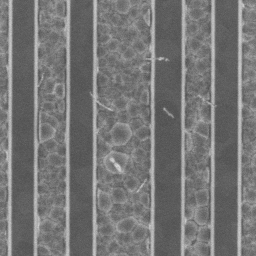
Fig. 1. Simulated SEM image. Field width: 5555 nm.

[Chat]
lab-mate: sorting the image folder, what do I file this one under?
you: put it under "one or a few lines or trenches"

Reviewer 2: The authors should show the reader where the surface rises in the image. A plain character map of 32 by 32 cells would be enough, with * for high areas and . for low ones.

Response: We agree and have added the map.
.****....***.......****....***..
.***.....***.......****....***..
.***.....***.......****....***..
.***.....***.......****....***..
.***.....***.......****....***..
.***.....***.......****....***..
.***.....***.......****....***..
.***.....***.......****....***..
.***.....***.......****....***..
.***.....***.......****....***..
.***.....***.......****....***..
.***.....***.......****....***..
.***.....***.......****...****..
.***.....***.......****...****..
.***.....***.......****....***..
.***.*...***.......****....***..
.*****...***.......****....***..
.***.....***.......****....***..
.***....****.......****....***..
.***....****.......****....***..
.***....****..*....****....***..
.***....****.......****....***..
.***....****.......****....***..
.***....****.......****....***..
.***....****.......****....***..
.***....****.......****....***..
.***....****.......****....***..
.***....****.......****....***..
.***....****.......****....***..
.***....****.......****....***..
.***....****.......****....***..
.***....****.......****....***..